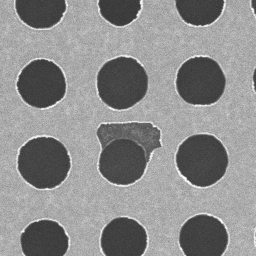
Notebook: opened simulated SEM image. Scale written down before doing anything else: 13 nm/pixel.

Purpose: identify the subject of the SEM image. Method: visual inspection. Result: holes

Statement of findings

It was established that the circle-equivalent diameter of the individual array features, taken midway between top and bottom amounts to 674 nm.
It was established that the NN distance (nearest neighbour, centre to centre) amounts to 1010 nm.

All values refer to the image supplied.